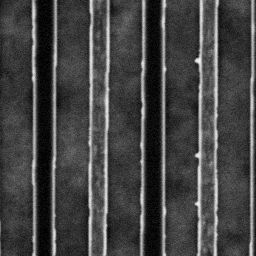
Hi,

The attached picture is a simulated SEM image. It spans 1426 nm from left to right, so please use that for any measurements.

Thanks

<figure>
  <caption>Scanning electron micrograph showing lines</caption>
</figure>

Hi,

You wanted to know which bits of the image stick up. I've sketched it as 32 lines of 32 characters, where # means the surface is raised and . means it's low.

....###....###....###....##.....
....###....###....###....##.....
....###....###....###....##.....
....###....###....###....##.....
....###....###....###....##.....
....###....###....###....##.....
....###....###....###....##.....
....###....###....###....##.....
....###....###....###....##.....
....###....##.....###....##....#
....###....##.....###....##....#
....###....##.....###....##....#
....###....##.....###....##....#
....###....##.....###....##....#
....###....##.....###....##....#
....###....##.....###....##....#
....###....##.....###....##....#
....###....##.....###....##....#
....###....##.....###....##....#
....###....##.....###....##....#
....###....##.....###....##....#
....###....##.....###....##....#
....###....##.....###....##....#
....###....##.....###....##....#
....###....##.....###....##....#
....###....##.....###....##....#
....###....##.....###....##....#
....###....##.....###....##....#
....###....##.....###....##....#
....###....##.....###....##....#
....###....##.....###....##....#
....###....##.....###....##....#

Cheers